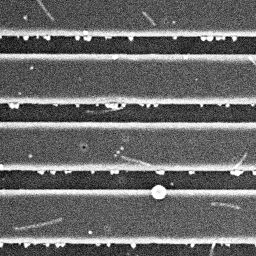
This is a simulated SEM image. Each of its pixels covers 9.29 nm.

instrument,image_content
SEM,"lines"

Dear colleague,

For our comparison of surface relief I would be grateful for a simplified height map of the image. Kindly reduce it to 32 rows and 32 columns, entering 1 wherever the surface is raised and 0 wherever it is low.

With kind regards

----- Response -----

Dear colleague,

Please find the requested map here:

11111111111111111111111111111111
11111111111111111111111111111111
11111111111111111111111111111111
11111111111111111111111111111111
00000000000000000000000000000000
00000000000000000000000000000000
00000000000000000000000000000000
11111111111111111111111111111111
11111111111111111111111111111111
11111111111111111111111111111111
11111111111111111111111111111111
11111111111111111111111111111111
11111111111111111111111111111111
00000000000000000000000000000000
00000000000000000000000000000000
00000000000000000000000000000000
11111111111111111111111111111111
11111111111111111111111111111111
11111111111111111111111111111111
11111111111111111111111111111111
11111111111111111111111111111111
00000000000000000000000000000000
00000000000000000000000000000000
00000000000000000001000000000000
11111111111111111111111111111111
11111111111111111111111111111111
11111111111111111111111111111111
11111111111111111111111111111111
11111111111111111111111111111111
11111111111111111111111111111111
00000000000000000000000000000000
00000000000000000000000000000000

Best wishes